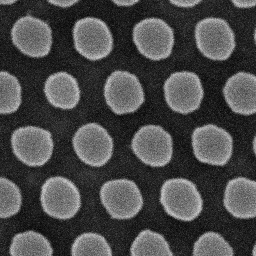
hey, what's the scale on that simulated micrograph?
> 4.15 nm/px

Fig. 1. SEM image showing a regular array of raised bodies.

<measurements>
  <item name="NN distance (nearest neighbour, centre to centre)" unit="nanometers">248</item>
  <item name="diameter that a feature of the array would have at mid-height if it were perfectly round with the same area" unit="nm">165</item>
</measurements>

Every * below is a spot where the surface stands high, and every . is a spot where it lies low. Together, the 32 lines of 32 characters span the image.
.......**......*......**.....***
................................
..***.....**......**......**....
..****...****....****....****...
..****...*****...*****...****...
..****...*****...*****...****...
...***....****....***....****...
................................
................................
*......**.....***....***.....***
**....****...****....****...****
**....****...*****...****...****
**....****...*****...****...****
**......*.....***.....**.....***
................................
................................
..****....***....****...****....
..****...*****...****...*****...
..*****..*****...****...*****...
..****....****...****....****...
...**......**......**...........
................................
*.....**..............*......**.
**...****....****...****....****
***..*****...*****..*****...****
***..*****...*****..*****...****
**....***.....***....****....***
................................
................................
..***.....**.....***.....***....
..****...****....****...****....
.*****...*****..*****...*****...